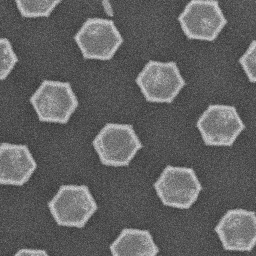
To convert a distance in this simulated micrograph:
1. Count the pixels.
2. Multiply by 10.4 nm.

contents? a regular array of raised bodies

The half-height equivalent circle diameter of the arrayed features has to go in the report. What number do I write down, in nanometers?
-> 421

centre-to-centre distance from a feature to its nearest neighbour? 782 nm